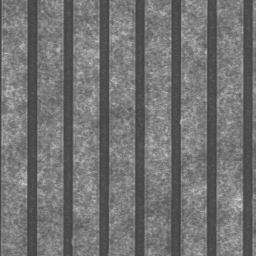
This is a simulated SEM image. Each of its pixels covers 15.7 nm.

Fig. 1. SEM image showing parallel lines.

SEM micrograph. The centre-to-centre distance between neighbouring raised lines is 562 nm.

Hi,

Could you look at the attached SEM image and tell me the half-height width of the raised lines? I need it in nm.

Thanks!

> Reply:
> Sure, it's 403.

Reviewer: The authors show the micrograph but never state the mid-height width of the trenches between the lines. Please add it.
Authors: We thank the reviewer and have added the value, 164 nm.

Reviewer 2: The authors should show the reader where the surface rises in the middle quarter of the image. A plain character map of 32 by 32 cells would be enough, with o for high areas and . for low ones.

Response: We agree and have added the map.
...oooooo..ooooooo..ooooooo...oo
...oooooo..ooooooo..ooooooo...oo
...oooooo..ooooooo..ooooooo...oo
...oooooo..ooooooo..ooooooo...oo
...oooooo..ooooooo..ooooooo...oo
...oooooo..ooooooo..ooooooo...oo
...oooooo..ooooooo..ooooooo...oo
...oooooo..ooooooo..ooooooo...oo
...oooooo..ooooooo..ooooooo...oo
...oooooo..ooooooo..ooooooo...oo
...oooooo..ooooooo..ooooooo..ooo
...oooooo..ooooooo..ooooooo..ooo
...oooooo...oooooo..ooooooo..ooo
...oooooo...oooooo..ooooooo..ooo
...oooooo...oooooo..ooooooo..ooo
...oooooo...oooooo..ooooooo..ooo
...oooooo...oooooo..ooooooo..ooo
..ooooooo...oooooo..ooooooo..ooo
..ooooooo...oooooo..ooooooo..ooo
..ooooooo...oooooo..ooooooo..ooo
..ooooooo...oooooo..ooooooo..ooo
..ooooooo...oooooo..ooooooo..ooo
..ooooooo...oooooo..ooooooo..ooo
..ooooooo...oooooo..ooooooo..ooo
..ooooooo...oooooo..ooooooo..ooo
..ooooooo...oooooo..ooooooo..ooo
..ooooooo...oooooo..ooooooo..ooo
..ooooooo...oooooo..ooooooo..ooo
..ooooooo...oooooo..ooooooo..ooo
..ooooooo...oooooo..ooooooo..ooo
..ooooooo...oooooo..ooooooo..ooo
..ooooooo...oooooo..ooooooo..ooo